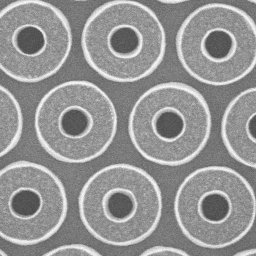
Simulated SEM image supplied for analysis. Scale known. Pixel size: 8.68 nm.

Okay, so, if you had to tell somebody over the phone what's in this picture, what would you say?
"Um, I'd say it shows ring-shaped raised bodies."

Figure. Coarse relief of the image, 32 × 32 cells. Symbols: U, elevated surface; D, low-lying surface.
DDUUUUDDDDDDDDUUUUDDDDDDDDDDDDDD
UUUUUUUDDDDDUUUUUUUDDDDDUUUUUUDD
UUUUUUUUDDDUUUUUUUUUDDDUUUUUUUUD
UUUDUUUUDDDUUUUDUUUUDDDUUUUUUUUU
UUDDDUUUUDUUUUDDDUUUDDUUUUDDDUUU
UUDDDDUUUDUUUUDDDUUUDDUUUDDDDUUU
UUUDDUUUUDDUUUDDDUUUDDUUUUDDDUUU
UUUUUUUUDDDUUUUUUUUUDDDUUUUUUUUU
UUUUUUUDDDDDUUUUUUUDDDDUUUUUUUUU
DUUUUUDDDDDDDUUUUUDDDDDDUUUUUUDD
DDDDDDDDUUUDDDDDDDDDDDDDDDUUDDDD
UDDDDDUUUUUUUDDDDDUUUUUUDDDDDDDU
UUDDDUUUUUUUUUDDDUUUUUUUUDDDDUUU
UUDDDUUUUUUUUUDDDUUUUUUUUUDDDUUU
UUUDUUUUDDDUUUUDUUUUDDDUUUDDUUUU
UUUDUUUUDDDUUUUDUUUDDDDUUUDDUUUD
UUDDDUUUDDDUUUDDUUUUDDDUUUDDUUUD
UUDDDUUUUUUUUUDDDUUUUUUUUUDDUUUU
UDDDDDUUUUUUUDDDDUUUUUUUUDDDUUUU
DDDDDDDUUUUUDDDDDDUUUUUUDDDDDUUU
DDDDDDDDDDDDDDDDDDDDDDDDDDDDDDDU
UUUUUUDDDDDDUUUUUUDDDDDDDUUUUDDD
UUUUUUUDDDDUUUUUUUUDDDDUUUUUUUUD
UUUUUUUUDDUUUUUUUUUUDDUUUUUUUUUD
UUDDDUUUDDUUUUDDUUUUDDUUUUDDUUUU
UDDDDUUUDDUUUDDDDUUUDDUUUDDDDUUU
UUDDDUUUDDUUUDDDDUUUDDUUUDDDDUUU
UUUUUUUUDDUUUUUUUUUUDDUUUUDDUUUU
UUUUUUUDDDDUUUUUUUUDDDDUUUUUUUUD
UUUUUUDDDDDDUUUUUUDDDDDDUUUUUUDD
DDDDDDDDDDDDDDUUDDDDDDDDDUUUDDDD
DDDDDDUUUUUUDDDDDDUUUUUDDDDDDDDU